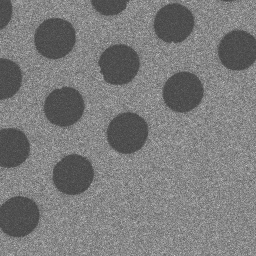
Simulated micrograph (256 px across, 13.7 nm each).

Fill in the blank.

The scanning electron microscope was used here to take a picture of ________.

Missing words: holes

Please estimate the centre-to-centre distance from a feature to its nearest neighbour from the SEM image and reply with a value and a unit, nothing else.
938 nanometers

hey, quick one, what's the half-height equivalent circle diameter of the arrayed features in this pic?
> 560 nm